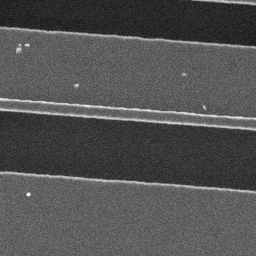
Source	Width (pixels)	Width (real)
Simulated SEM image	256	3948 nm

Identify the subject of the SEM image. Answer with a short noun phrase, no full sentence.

lines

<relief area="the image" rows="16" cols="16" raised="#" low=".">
................
................
##########......
################
################
################
################
........########
................
................
................
##########......
################
################
################
################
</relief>